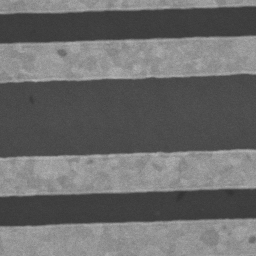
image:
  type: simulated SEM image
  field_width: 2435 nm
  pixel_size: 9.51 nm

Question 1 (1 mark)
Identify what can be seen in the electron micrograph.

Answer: lines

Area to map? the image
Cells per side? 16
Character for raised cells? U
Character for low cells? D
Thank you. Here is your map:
UUUUUUUUUUUUDDDD
DDDDDDDDDDDDDDDD
DDDDDDDDUUUUUUUU
UUUUUUUUUUUUUUUU
UUUUUUUUUUUUUUUU
DDDDDDDDDDDDDDDD
DDDDDDDDDDDDDDDD
DDDDDDDDDDDDDDDD
DDDDDDDDDDDDDDDD
DDDDDDDDDDDDUUUU
UUUUUUUUUUUUUUUU
UUUUUUUUUUUUUUUU
DDDDDDDDDDDDDDDD
DDDDDDDDDDDDDDDD
UUUUUUUUUUUUUUUU
UUUUUUUUUUUUUUUU